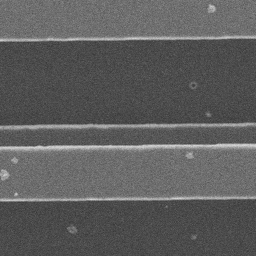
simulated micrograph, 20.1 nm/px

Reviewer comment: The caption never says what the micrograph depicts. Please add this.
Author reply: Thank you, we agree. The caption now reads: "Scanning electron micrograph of lines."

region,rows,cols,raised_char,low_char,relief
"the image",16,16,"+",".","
++++++++++++++++
++++++++++++++++
+...............
................
................
................
................
................
................
++++++++++++++++
++++++++++++++++
++++++++++++++++
++..............
................
................
................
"